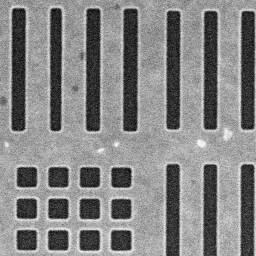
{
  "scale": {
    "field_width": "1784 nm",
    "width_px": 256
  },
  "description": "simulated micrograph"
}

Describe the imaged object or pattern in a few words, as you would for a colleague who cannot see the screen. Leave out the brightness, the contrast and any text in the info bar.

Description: groups of lines, slits or small figures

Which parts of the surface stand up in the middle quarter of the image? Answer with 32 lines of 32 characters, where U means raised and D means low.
UUUUUDDDDUUUUUUDDDDUUUUUUDDDDUUU
UUUUUDDDDUUUUUUDDDDUUUUUUDDDDUUU
UUUUUDDDDUUUUUUDDDDUUUUUUDDDDUUU
UUUUUDDDDUUUUUUDDDDUUUUUUDDDDUUU
UUUUUDDDDUUUUUUDDDDUUUUUUDDDDUUU
UUUUUDDDDUUUUUUDDDDUUUUUUDDDDUUU
UUUUUDDDDUUUUUUDDDDUUUUUUDDDDUUU
UUUUUDDDDUUUUUUDDDDUUUUUUDDDDUUU
UUUUUDDDDUUUUUUDDDDUUUUUUDDDDUUU
UUUUUDDDDUUUUUUDDDDUUUUUUDDDDUUU
UUUUUDDDDUUUUUUDDDDUUUUUUDDDDUUU
UUUUUDDDDUUUUUUDDDDUUUUUUDDDDUUU
UUUUUDDDDUUUUUUDDDDUUUUUUDDDDUUU
UUUUUDDDDUUUUUUDDDDUUUUUUDDDDUUU
UUUUUDDDDUUUUUUDDDDUUUUUUDDDDUUU
UUUUUDDDDUUUUUUDDDDUUUUUUDDDDUUU
UUUUUDDDDUUUUUUDDDUUUUUUUUDDDUUU
UUUUUUUUUUUUUUUUUUUUUUUUUUUUUUUU
UUUUUUUUUUUUUUUUUUUUUUUUUUUUUUUU
UUUUUUUUUUUUUUUUUUUUUUUUUUUUUUUU
UUUUUUUUUUUUUUUUUUUUUUUUUUUUUUUU
UUUUUUUUUUUUUUUUUUUUUUUUUUUUUUUU
UUUUUUUUUUUUUUUUUUUUUUUUUUUUUUUU
UUUUUUUUUUUUUUUUUUUUUUUUUUUUUUUU
UUUUUUUUUUUUUUUUUUUUUUUUUUUUUUUU
UUUUUUUUUUUUUUUUUUUUUUUUUDDDDUUU
DUUUDDDDDUUUDDDDDUUUUUUUUDDDDUUU
DUUUDDDDDUUDDDDDDUUUUUUUUDDDDUUU
DUUUDDDDDUUDDDDDDUUUUUUUUDDDDUUU
DUUUDDDDDUUDDDDDDUUUUUUUUDDDDUUU
DUUUDDDDDUUUDDDDDUUUUUUUUDDDDUUU
UUUUUUUUUUUUUUUUUUUUUUUUUDDDDUUU